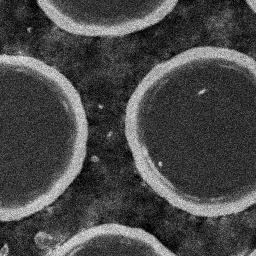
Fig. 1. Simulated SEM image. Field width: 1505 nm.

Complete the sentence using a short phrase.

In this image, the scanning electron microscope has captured raised bodies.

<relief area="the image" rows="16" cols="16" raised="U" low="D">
DDDUUUUUUUDDDDDD
DDDDUUUUUDDDDDDD
DDDDDDDDDDDDDDDD
DDDDDDDDDDDDUUUD
UUUDDDDDDDUUUUUU
UUUUDDDDDUUUUUUU
UUUUUDDDUUUUUUUU
UUUUUDDDUUUUUUUU
UUUUUDDDUUUUUUUU
UUUUUDDDDUUUUUUU
UUUUUDDDDUUUUUUU
UUUUDDDDDDUUUUUU
UUUDDDDDDDDUUUUU
DDDDDDDDDDDDDDDD
DDDDDDUUDDDDDDDD
DDDDUUUUUUDDDDDD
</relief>